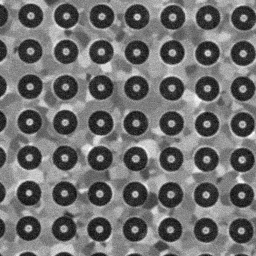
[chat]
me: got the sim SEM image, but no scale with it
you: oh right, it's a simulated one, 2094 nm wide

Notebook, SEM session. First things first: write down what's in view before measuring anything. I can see an array of small figures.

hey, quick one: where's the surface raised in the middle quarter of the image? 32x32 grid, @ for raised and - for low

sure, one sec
@@@@@@@@@@@@@@@@@@@@@@@@@@@@@@@@
@@@@@@@@@@@@@@@@@@@@@@@@@@@@@@@@
@@@@@@@@@@@@@@@@@@@@@@@@@@@@@@@@
---@@@@----@@@@@----@@@@@----@@@
---@@@------@@@------@@@------@@
@---@@---@--@@@---@--@@@------@@
----@@------@@@---@--@@@------@@
---@@@------@@@------@@@------@@
--@@@@@----@@@@@----@@@@@----@@@
@@@@@@@@@@@@@@@@@@@@@@@@@@@@@@@@
@@@@@@@@@@@@@@@@@@@@@@@@@@@@@@@@
-@@@@@@@@@@@@@@@@@@@@@@@@@@@@@@@
---@@@@----@@@@@----@@@@@----@@@
---@@@------@@@------@@@------@@
@---@@---@---@@---@--@@@--@---@@
---@@@-------@@------@@@------@@
---@@@------@@@------@@@------@@
-@@@@@@----@@@@@----@@@@@----@@@
@@@@@@@@@@@@@@@@@@@@@@@@@@@@@@@@
@@@@@@@@@@@@@@@@@@@@@@@@@@@@@@@@
-@@@@@@@--@@@@@@@@@@@@@@@@@@@@@@
---@@@@-----@@@@----@@@@@----@@@
---@@@------@@@------@@@------@@
@---@@--@@--@@@--@@--@@@--@---@@
---@@@------@@@------@@@------@@
---@@@------@@@------@@@-----@@@
-@@@@@@@--@@@@@@---@@@@@@---@@@@
@@@@@@@@@@@@@@@@@@@@@@@@@@@@@@@@
@@@@@@@@@@@@@@@@@@@@@@@@@@@@@@@@
-@@@@@@@--@@@@@@@--@@@@@@@--@@@@
---@@@-----@@@@-----@@@@-----@@@
---@@@------@@@------@@@------@@